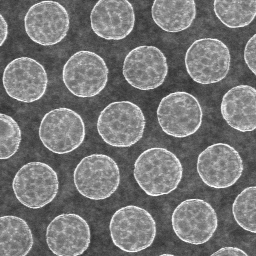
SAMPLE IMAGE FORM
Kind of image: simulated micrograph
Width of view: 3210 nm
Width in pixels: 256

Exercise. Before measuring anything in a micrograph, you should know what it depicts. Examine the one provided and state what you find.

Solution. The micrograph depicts a regular array of raised bodies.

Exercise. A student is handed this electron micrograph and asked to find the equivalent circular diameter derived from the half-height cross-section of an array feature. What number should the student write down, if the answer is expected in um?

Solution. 0.553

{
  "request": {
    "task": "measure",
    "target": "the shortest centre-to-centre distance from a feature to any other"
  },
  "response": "60.2 pixels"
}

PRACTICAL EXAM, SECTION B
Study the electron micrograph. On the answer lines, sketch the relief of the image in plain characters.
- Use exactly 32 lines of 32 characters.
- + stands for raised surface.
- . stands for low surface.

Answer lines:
.....++.....++++...+++++...+++++
....++++....+++++..+++++...+++++
...++++++..++++++..+++++....+++.
+..+++++....++++....+++.........
+...++++.....+++................
.....+..................++++...+
..........+.....++++...++++++..+
..++.....++++...+++++..++++++..+
.++++...+++++..++++++..++++++..+
++++++..+++++...+++++...++++....
.+++++..+++++...++++............
.++++....+++.................+++
..++................++++....++++
.............++++...+++++...++++
+.....++++...+++++..+++++...++++
++...+++++..++++++..+++++....+++
++...+++++..++++++...+++........
++...+++++...++++...............
++....+++.................+++...
+..........++.....++++...+++++..
....+.....++++...+++++...+++++..
..+++++..++++++..++++++..+++++..
..+++++..++++++..+++++...++++...
..+++++...++++....++++.........+
..+++++....+++................++
...+++.................+++...+++
...............+++....+++++..+++
+++....+++....+++++...+++++...++
++++..+++++...+++++...+++++....+
++++..+++++...+++++...++++......
++++..+++++....++++.............
+++....+++.................+++..